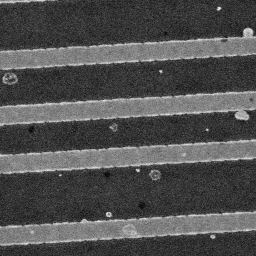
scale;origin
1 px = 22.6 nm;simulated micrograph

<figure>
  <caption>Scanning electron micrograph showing lines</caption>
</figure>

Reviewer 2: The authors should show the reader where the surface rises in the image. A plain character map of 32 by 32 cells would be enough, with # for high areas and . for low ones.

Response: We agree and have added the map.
................................
................................
................................
................................
..............................##
................################
################################
####################............
###.............................
................................
................................
..............................##
..............##################
################################
##################............#.
#...............................
................................
................................
...............#################
################################
###################.............
####............................
................................
................................
................................
................................
...............................#
................################
################################
####################............
##..............................
................................